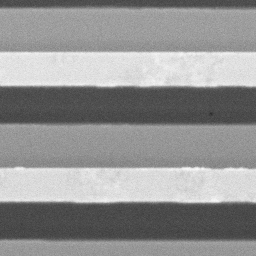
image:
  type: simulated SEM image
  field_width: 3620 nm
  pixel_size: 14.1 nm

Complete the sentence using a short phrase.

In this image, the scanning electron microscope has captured lines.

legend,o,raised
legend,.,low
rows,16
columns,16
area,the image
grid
................
oooooooooooooooo
oooooooooooooooo
oooooooooooooooo
oooooooooooooooo
................
................
................
oooooooooooooooo
oooooooooooooooo
oooooooooooooooo
oooooooooooooooo
oooooooooooooooo
................
................
oooooooooooooooo